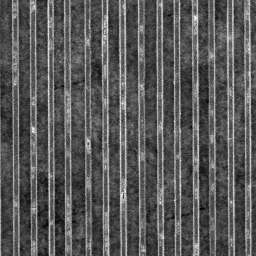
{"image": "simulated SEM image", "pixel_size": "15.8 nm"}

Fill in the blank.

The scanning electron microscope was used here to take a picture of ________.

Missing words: parallel lines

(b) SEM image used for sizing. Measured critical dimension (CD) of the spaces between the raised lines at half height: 200 nanometres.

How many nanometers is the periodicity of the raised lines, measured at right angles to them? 283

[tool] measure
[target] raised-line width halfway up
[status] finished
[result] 81.2 nm